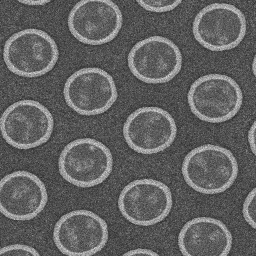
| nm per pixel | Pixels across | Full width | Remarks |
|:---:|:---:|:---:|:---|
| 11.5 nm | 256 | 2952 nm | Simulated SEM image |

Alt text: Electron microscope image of a regular array of raised bodies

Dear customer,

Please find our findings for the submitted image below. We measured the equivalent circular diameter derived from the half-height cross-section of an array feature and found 539 nm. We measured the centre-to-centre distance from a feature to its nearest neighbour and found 816 nm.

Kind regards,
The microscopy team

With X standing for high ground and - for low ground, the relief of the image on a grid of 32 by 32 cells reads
----------XXXX----XXXX----------
---------XXXXXX----------XXXXX--
---------XXXXXX----------XXXXX--
---------XXXXXX---------XXXXXX--
--XXXX----XXXX-----------XXXXX--
-XXXXXX-----------XXX-----XXX---
-XXXXXX----------XXXXX----------
-XXXXXX---------XXXXXX----------
-XXXXX-----------XXXXX----------
---------XXXX----XXXX-----------
--------XXXXXX-----------XXXX---
--------XXXXXX----------XXXXXX--
--------XXXXXX----------XXXXXX--
-XXXX----XXXX-----------XXXXXX--
-XXXXX-----------XXXX----XXXX---
XXXXXX----------XXXXXX----------
XXXXXX----------XXXXXX---------X
-XXXX-----------XXXXX----------X
--------XXXXX----XXX-----XX-----
--------XXXXXX----------XXXXX---
--------XXXXXX---------XXXXXX---
--------XXXXX----------XXXXXX---
-XXXX----XXXX----------XXXXXX---
XXXXX-----------XXXXX----XXX----
XXXXXX---------XXXXXX----------X
XXXXX----------XXXXXX----------X
XXXXX----------XXXXXX----------X
--------XXXXX---XXXX-----X-----X
-------XXXXXX----------XXXXX----
-------XXXXXX----------XXXXXX---
-------XXXXXX----------XXXXXX---
XXXX----XXXX-----XX----XXXXX----